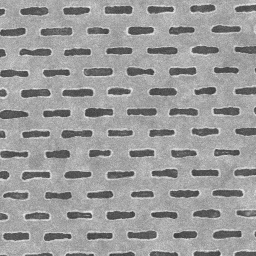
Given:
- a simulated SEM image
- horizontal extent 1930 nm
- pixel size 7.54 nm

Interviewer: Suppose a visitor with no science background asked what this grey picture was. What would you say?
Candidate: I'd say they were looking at a regular array of holes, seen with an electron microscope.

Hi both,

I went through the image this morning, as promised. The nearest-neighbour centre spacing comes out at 28.4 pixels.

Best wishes